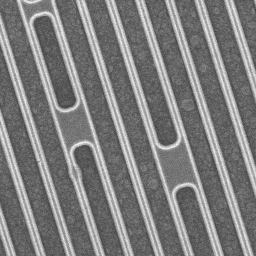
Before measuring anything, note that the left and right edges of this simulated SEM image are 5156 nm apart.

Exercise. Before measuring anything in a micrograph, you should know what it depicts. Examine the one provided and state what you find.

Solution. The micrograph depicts parallel lines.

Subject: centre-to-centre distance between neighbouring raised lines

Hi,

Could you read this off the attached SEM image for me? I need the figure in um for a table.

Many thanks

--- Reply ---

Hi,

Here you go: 0.571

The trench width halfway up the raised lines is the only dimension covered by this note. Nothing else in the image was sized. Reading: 433 nanometers